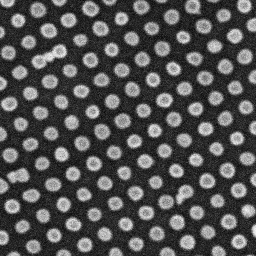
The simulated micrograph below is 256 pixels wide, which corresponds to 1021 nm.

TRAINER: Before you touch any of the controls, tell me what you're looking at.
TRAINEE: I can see a regular array of raised bodies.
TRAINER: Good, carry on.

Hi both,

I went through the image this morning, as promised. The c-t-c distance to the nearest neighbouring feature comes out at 89.4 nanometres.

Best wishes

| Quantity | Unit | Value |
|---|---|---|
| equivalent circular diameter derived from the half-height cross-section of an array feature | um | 0.0514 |